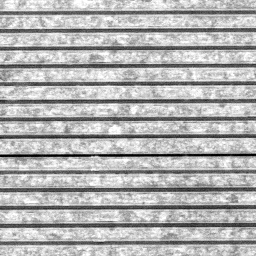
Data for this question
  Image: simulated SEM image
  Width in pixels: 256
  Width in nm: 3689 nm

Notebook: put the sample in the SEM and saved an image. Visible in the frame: parallel lines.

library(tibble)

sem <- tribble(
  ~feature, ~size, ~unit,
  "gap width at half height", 0.0684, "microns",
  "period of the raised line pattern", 255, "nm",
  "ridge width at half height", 180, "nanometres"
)